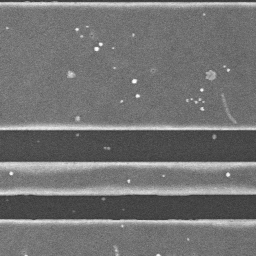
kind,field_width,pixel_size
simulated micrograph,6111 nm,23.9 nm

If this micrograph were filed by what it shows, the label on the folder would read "lines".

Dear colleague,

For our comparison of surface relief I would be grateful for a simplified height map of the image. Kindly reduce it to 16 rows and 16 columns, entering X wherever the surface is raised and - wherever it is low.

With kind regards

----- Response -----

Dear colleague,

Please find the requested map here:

XXXXXXXXXXXXXXXX
XXXXXXXXXXXXXXXX
XXXXXXXXXXXXXXXX
XXXXXXXXXXXXXXXX
XXXXXXXXXXXXXXXX
XXXXXXXXXXXXXXXX
XXXXXXXXXXXXXXXX
XXXXXXXXXXXXXXXX
----------------
----------------
XXXXXXXXXXXXXXXX
XXXXXXXXXXXXXXXX
----------------
----------------
XXXXXXXXXXXXXXXX
XXXXXXXXXXXXXXXX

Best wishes